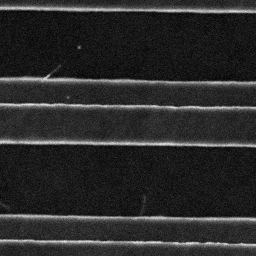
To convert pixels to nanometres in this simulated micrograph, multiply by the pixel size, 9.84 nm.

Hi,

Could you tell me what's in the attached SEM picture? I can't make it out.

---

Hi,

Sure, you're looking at lines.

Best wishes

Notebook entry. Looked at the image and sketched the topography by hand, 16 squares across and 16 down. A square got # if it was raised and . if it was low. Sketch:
################
................
................
................
................
################
################
################
################
................
................
................
................
................
################
################